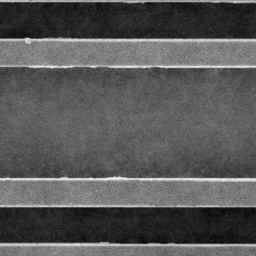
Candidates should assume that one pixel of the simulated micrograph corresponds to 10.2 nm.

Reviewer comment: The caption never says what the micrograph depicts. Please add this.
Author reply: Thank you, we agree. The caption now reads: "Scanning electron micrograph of lines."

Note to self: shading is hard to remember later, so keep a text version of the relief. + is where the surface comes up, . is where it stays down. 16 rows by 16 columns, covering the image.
................
................
++++++++++++++++
++++++++++++++++
................
................
................
................
................
................
................
++++++++++++++++
++++++++++++++++
................
................
++++++++++++++++